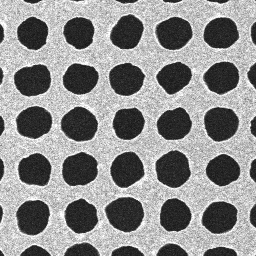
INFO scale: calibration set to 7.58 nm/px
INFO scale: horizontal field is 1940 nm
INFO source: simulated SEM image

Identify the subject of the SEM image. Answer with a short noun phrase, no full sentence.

a regular array of holes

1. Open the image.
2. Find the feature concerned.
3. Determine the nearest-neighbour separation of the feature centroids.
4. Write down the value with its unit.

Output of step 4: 340 nm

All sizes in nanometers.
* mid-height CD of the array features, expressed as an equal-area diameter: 255